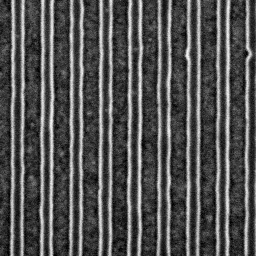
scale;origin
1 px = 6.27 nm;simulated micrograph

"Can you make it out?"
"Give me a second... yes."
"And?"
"parallel lines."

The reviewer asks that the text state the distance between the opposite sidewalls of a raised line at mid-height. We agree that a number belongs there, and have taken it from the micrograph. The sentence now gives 69 nanometers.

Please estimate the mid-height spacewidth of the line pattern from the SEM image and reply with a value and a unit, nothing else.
113 nanometres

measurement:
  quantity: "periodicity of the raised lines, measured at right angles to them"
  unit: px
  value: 29.3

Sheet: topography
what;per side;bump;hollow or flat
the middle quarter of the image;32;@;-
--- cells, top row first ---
--@@-----@@@----@@@-----@@-----@
--@@-----@@@----@@@-----@@-----@
--@@-----@@@----@@@-----@@-----@
--@@-----@@@----@@@-----@@-----@
--@@-----@@@----@@@-----@@-----@
--@@-----@@@----@@@-----@@-----@
--@@-----@@@----@@@-----@@-----@
--@@-----@@@----@@@-----@@-----@
--@@-----@@@----@@@-----@@-----@
--@@-----@@@----@@@-----@@-----@
--@@-----@@@----@@@-----@@-----@
--@@-----@@@----@@@-----@@-----@
--@@-----@@@----@@@-----@@-----@
--@@-----@@@----@@@-----@@-----@
--@@-----@@@----@@@-----@@-----@
--@@-----@@@----@@@-----@@-----@
--@@-----@@@----@@@-----@@-----@
--@@-----@@@----@@@-----@@-----@
--@@-----@@@----@@@-----@@-----@
--@@-----@@@----@@@-----@@-----@
--@@-----@@@----@@@-----@@-----@
--@@-----@@@----@@@-----@@-----@
--@@-----@@@----@@@-----@@-----@
--@@-----@@@----@@@-----@@-----@
--@@-----@@@----@@@-----@@-----@
--@@-----@@@----@@@-----@@-----@
--@@-----@@@----@@@-----@@-----@
--@@-----@@@----@@@-----@@-----@
--@@-----@@@----@@@-----@@-----@
--@@-----@@@----@@@-----@@-----@
--@@-----@@@----@@@-----@@-----@
--@@-----@@@----@@@-----@@-----@